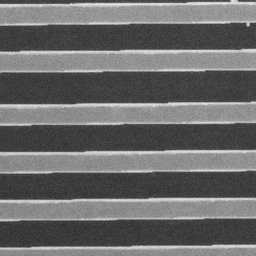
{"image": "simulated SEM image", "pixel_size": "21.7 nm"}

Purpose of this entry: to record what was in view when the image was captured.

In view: lines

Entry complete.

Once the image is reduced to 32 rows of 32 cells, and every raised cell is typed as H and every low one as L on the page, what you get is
LLLLLLLLLLLLLHHHHHHHHHHHHHHHHHHH
HHHHHHHHHHHHHHHHHHHHHHHHHHHHHHHH
HHHHHHHHHHHHHHHHHHHHHHHHHHHHHHHH
LLLLLLLLLLLLLLLLLLLLLLLLLLLLLLLL
LLLLLLLLLLLLLLLLLLLLLLLLLLLLLLLL
LLLLLLLLLLLLLLLLLLLLLLLLLLLLLLLL
LLLLLLHHHHHHHHHHHHHHHHHHHHHHHHHH
HHHHHHHHHHHHHHHHHHHHHHHHHHHHHHHH
HHHHHHHHHHHHHHHHHHHHHHHHHHHHHHHH
LLLLLLLLLLLLLLLLLLLLLLLLLLLLLLLL
LLLLLLLLLLLLLLLLLLLLLLLLLLLLLLLL
LLLLLLLLLLLLLLLLLLLLLLLLLLLLLLLL
LLLLLLLLLLLLLLLLLLLLLLLLLLLLLLLL
HHHHHHHHHHHHHHHHHHHHHHHHHHHHHHHH
HHHHHHHHHHHHHHHHHHHHHHHHHHHHHHHH
HHHHHHHHHHHHHHLLLLLLLLLLLLLLLLLL
LLLLLLLLLLLLLLLLLLLLLLLLLLLLLLLL
LLLLLLLLLLLLLLLLLLLLLLLLLLLLLLLL
LLLLLLLLLLLLLLLLLLLLLLLLLLLLLLLL
HHHHHHHHHHHHHHHHHHHHHHHHHHHHHHHH
HHHHHHHHHHHHHHHHHHHHHHHHHHHHHHHH
HHHHHHLLLLLLLLLLLLLLLLLLLLLLLLLL
LLLLLLLLLLLLLLLLLLLLLLLLLLLLLLLL
LLLLLLLLLLLLLLLLLLLLLLLLLLLLLLLL
LLLLLLLLLLLLLLLLLLLLLLLLLLLLLLLL
HHHHHHHHHHHHHHHHHHHHHHHHHHHHHHHH
HHHHHHHHHHHHHHHHHHHHHHHHHHHHHHHH
HLLLLLLLLLLLLLLLLLLLLLLLLLLLLLLL
LLLLLLLLLLLLLLLLLLLLLLLLLLLLLLLL
LLLLLLLLLLLLLLLLLLLLLLLLLLLLLLLL
LLLLLLLLLLLLLLLLLLLLLLLLLLLLLLLL
HHHHHHHHHHHHHHHHHHHHHHHHHHHHHHHH